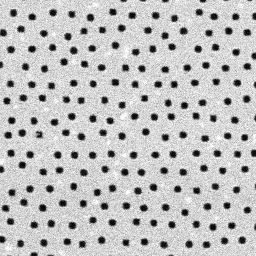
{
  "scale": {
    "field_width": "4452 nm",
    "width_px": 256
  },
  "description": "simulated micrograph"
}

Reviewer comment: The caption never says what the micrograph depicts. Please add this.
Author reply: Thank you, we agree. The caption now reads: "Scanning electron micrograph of a regular array of holes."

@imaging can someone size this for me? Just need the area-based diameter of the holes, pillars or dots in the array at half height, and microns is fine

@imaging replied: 0.139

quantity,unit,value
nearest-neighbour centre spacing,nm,294